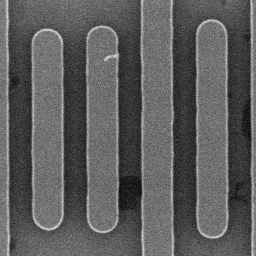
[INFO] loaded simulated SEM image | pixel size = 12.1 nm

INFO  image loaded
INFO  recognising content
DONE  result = groups of lines, slits or small figures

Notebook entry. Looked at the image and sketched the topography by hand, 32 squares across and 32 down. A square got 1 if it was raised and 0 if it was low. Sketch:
10000000000000000011100000000001
10000000000000000011100000000001
10000000000000000011100000000001
10000000000011000011100001110001
10001110000111100011100001110001
10001111000111100011100001110001
10001111000111100011100001110001
10001111000111100011100001110001
10001111000111100011100001110001
10001111000111100011100001110001
10001111000111100011100001110001
10001111000111100011100001110001
10001111000111100011100001110001
10001111000111100011110001110001
10001111000111100011110001110001
10001111000111100011110001110001
10001111000111100011100001110001
10001111000111100011100001110000
10001111000111100011110001110000
10001111000111100011110001110000
10001111000111100011100001110001
10001111000111100011100001110001
10001111000111100011100001110001
10001111000111100011100001110000
10001111000111100011100001110000
10001111000111100011100001110000
10001111000111100011110001110000
10001111000111100011100001110000
10000110000011000011100001110000
10000000000000000011110000110000
10000000000000000011110000000000
10000000000000000011110000000000